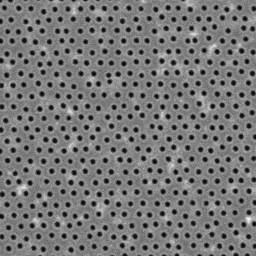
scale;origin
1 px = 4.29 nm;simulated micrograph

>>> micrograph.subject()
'a regular array of holes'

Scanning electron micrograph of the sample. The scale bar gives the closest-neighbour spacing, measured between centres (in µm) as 0.0462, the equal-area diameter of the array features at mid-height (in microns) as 0.0237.